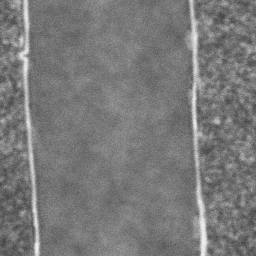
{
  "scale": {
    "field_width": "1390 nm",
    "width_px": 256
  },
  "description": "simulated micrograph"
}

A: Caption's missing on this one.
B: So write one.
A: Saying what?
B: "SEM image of one or a few lines or trenches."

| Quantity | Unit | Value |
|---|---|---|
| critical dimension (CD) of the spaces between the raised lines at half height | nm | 893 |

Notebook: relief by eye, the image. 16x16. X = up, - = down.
XX----------XXXX
XX----------XXXX
XX----------XXXX
XX----------XXXX
XX----------XXXX
XX----------XXXX
XX----------XXXX
XX----------XXXX
XX----------XXXX
XX----------XXXX
XX----------XXXX
XX----------XXXX
XX----------XXXX
XX-----------XXX
XX-----------XXX
XX-----------XXX